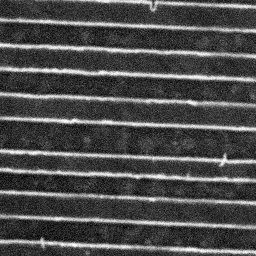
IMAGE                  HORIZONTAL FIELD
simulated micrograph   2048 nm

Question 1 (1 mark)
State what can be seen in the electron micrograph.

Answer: parallel lines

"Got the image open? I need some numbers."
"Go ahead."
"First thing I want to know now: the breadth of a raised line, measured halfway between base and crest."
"205 nm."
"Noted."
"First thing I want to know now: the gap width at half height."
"190 nm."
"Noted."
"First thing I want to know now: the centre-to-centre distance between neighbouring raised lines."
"392 nanometers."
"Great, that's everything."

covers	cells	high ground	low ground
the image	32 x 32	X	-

XXXXXXXXXXXXXXXXXXXXXXXXX-------
XXXXXXXXXXXXXXXXXXXXXXXXXXXXXXXX
XXXXXXXXXXXXXXXXXXXXXXXXXXXXXXXX
----------------------XXXXXXXXXX
--------------------------------
--------------------------------
XXXXXXXXXXXXXXXXXXXX-XX---------
XXXXXXXXXXXXXXXXXXXXXXXXXXXXXXXX
XXXXXXXXXXXXXXXXXXXXXXXXXXXXXXXX
--------------------XXXXXXXXXXXX
--------------------------------
--------------------------------
XXXXXXXXXXXXXXXXX---------------
XXXXXXXXXXXXXXXXXXXXXXXXXXXXXXXX
XXXXXXXXXXXXXXXXXXXXXXXXXXXXXXXX
----------------XXXXXXXXXXXXXXXX
--------------------------------
--------------------------------
--------------------------------
XXXXXXXXXXXXXXX-----------------
XXXXXXXXXXXXXXXXXXXXXXXXXXXXXXXX
---XXXXXXXXXXXXXXXXXXXXXXXXXXXXX
--------------------------X-XXXX
--------------------------------
XXXXXXXXXXXXX-------------------
XXXXXXXXXXXXXXXXXXXXXXXXXXXXXXXX
XXXXXXXXXXXXXXXXXXXXXXXXXXXXXXXX
----------XXXXXXXXXXXXXXXXXXXXXX
--------------------------------
--------------------------------
XXXXXXXX-X----------------------
XXXXXXXXXXXXXXXXXXXXXXXXXXXXXXXX